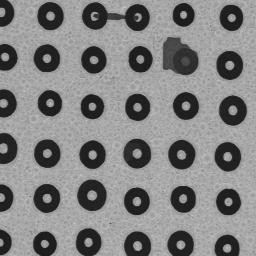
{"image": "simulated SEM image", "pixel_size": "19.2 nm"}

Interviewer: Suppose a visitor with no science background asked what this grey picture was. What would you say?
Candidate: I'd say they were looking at a regular array of ring-shaped grooves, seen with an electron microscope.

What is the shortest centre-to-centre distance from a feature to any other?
44.7 pixels